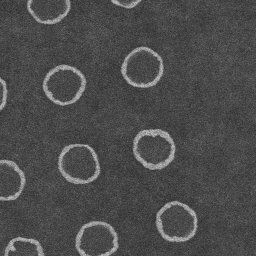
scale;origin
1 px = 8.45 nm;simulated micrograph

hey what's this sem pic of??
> raised bodies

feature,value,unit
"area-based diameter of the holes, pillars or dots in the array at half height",325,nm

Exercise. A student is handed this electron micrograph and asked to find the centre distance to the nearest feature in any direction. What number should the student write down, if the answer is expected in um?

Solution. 0.646